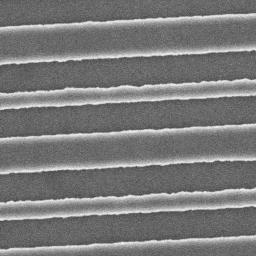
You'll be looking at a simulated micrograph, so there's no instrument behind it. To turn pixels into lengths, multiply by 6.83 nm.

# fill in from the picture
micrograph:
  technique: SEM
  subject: lines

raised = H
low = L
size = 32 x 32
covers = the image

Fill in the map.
LLLLLLLLLLLLLLLLLLLLLLLLLLLLLLLL
LLLLLLLLLLLLLLLLLLLLLLLLLLLLLLLL
LLLLLLLLLLLLLLLLHHHHHHHHHHHHHHHH
HHHHHHHHHHHHHHHHHHHHHHHHHHHHHHHH
HHHHHHHHHHHHHHHHHHHHHHHHHHHHHHHH
HHHHHHHHHHHHHHHHHHHHHHHHHHHHHHHH
HHHHHHHHHHHHHHHHHHHHHHHHHHLLLLLL
HHHHHHHHHHLLLLLLLLLLLLLLLLLLLLLL
LLLLLLLLLLLLLLLLLLLLLLLLLLLLLLLL
LLLLLLLLLLLLLLLLLLLLLLLLLLLLLLLL
LLLLLLLLLLLLLLLLLLLLLLLHHHHHHHHH
LLLLHHHHHHHHHHHHHHHHHHHHHHHHHHHH
HHHHHHHHHHHHHHHHHHHHLLLLLLLLLLLL
HHLLLLLLLLLLLLLLLLLLLLLLLLLLLLLL
LLLLLLLLLLLLLLLLLLLLLLLLLLLLLLLL
LLLLLLLLLLLLLLLLLLLLLLLLLLLLLLLH
LLLLLLLLLLLLLLLHHHHHHHHHHHHHHHHH
HHHHHHHHHHHHHHHHHHHHHHHHHHHHHHHH
HHHHHHHHHHHHHHHHHHHHHHHHHHHHHHHH
HHHHHHHHHHHHHHHHHHHHHHHHHHHHHHHH
HHHHHHHHHHHHHHHHHHHHHHLLLLLLLLLL
HHHLLLLLLLLLLLLLLLLLLLLLLLLLLLLL
LLLLLLLLLLLLLLLLLLLLLLLLLLLLLLLL
LLLLLLLLLLLLLLLLLLLLLLLLLLLLLLLL
LLLLLLLLLLLLLLLLHLHHHHHHHHHHHHHH
HHHHHHHHHHHHHHHHHHHHHHHHHHHHHHHH
HHHHHHHHHHHHHHHHHHHLLLLLLLLLLLLL
LLLLLLLLLLLLLLLLLLLLLLLLLLLLLLLL
LLLLLLLLLLLLLLLLLLLLLLLLLLLLLLLL
LLLLLLLLLLLLLLLLLLLLLLLLLLLLLLLL
LLLLLLLLLLLLLLHHHHHHHHHHHHHHHHHH
HHHHHHHHHHHHHHHHHHHHHHHHHHHHHHHH